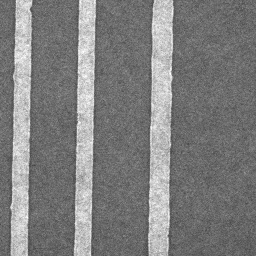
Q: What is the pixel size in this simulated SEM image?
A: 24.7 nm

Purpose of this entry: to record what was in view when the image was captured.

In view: one or a few lines or trenches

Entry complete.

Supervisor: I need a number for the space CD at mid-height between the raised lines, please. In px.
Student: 52.9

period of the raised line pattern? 1720 nm